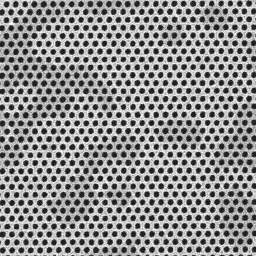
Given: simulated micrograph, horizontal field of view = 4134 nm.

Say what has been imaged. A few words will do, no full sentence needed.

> a regular array of holes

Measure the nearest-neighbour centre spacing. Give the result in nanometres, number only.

142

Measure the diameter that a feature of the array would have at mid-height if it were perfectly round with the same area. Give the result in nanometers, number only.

105